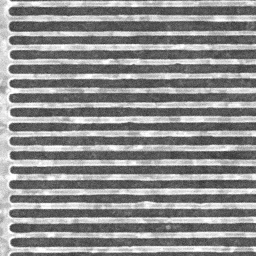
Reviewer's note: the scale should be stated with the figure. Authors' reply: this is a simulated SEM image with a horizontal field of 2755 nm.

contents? parallel lines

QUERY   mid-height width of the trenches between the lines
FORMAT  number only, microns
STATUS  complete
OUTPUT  0.109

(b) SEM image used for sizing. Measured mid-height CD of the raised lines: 4.25 pixels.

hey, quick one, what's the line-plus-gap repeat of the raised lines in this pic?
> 156 nm